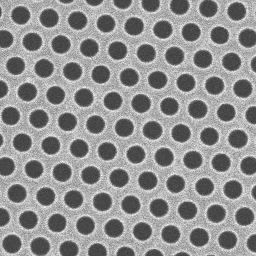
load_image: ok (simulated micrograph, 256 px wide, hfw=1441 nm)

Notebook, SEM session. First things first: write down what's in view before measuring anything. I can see a regular array of holes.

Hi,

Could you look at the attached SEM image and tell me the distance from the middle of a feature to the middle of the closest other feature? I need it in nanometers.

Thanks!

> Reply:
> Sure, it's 160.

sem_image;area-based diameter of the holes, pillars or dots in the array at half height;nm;100